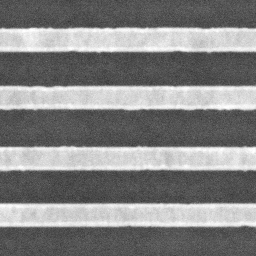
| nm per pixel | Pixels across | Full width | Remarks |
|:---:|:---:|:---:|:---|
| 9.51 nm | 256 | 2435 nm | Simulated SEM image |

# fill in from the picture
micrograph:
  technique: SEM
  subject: lines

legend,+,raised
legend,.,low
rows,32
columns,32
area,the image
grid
................................
................................
................................
................................
++++++++++++++++++++++++++++++++
++++++++++++++++++++++++++++++++
................................
................................
................................
................................
................................
++++++++++++++++++++++++++++++++
++++++++++++++++++++++++++++++++
++++++++++++++++++++++++++++++++
................................
................................
................................
................................
++++++++++++++++++++++++++++++++
++++++++++++++++++++++++++++++++
++++++++++++++++++++++++++++++++
................................
................................
................................
................................
................................
++++++++++++++++++++++++++++++++
++++++++++++++++++++++++++++++++
................................
................................
................................
................................